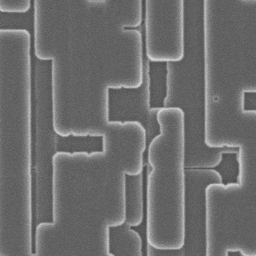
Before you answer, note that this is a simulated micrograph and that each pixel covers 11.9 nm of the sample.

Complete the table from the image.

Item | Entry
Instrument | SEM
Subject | wiring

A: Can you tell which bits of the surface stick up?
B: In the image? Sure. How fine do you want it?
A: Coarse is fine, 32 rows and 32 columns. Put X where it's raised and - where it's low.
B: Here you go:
XXXXXXXXXXXXXXXXXXXXXXX---XXXXXX
----XXXXXXXXXXXXXXXXXXX---XXXXXX
----XXXXXXXXXXXXXXXXXXX---XXXXXX
----XXXXXXXXXXXXX-XXXXX---XXXXXX
XXXXXXXXXXXXXXXXXXXXXXX---XXXXXX
XXXXXXXXXXXXXXXXXXXXXXX---XXXXXX
XXXXXXXXXXXXXXXXXXXXXXX---XXXXXX
XXXX--XXXXXXXXXXXX---X----XXXXXX
XXXX---XXXXXXXXXXX--------XXXXXX
XXXX---XXXXXXXXXXX--------XXXXXX
XXXX---XXXXXXXXXXX--------XXXXXX
XXXX---XXXXXX-------------XXXXX-
XXXX---XXXXXX-------------XXXX--
XXXX---XXXXXX-------------XXXXX-
XXXX---XXXXXX-------XXX---XXXXXX
XXXX---XXXXXXXXXX---XXX---XXXXXX
XXXX---XXXXXXXXXXX--XXX---XXXXXX
XXXX---------XXXXX-XXXX---XXXXXX
XXXX---------XXXXXXXXXX-------XX
XXXX---XXXXXXXXXXX-XXXX-------XX
XXXX---XXXXXXXXXXX-XXXX-------XX
XXXX---XXXXXXXXXX--XXXX-------XX
XXXX---XXXXXXXXX---XXXX-------XX
XXXX---XXXXXXXXX---XXXX---XXXXXX
XXXX---XXXXXXXXX---XXXX---XXXXXX
XXXX---XXXXXXXXX---XXXX---XXXXXX
XXXX---XXXXXXXXX---XXXX---XXXXXX
XXXX---XXXXXXXXX---XXXX---XXXXXX
XXXX-XXXXXXXXX-----XXXX---XXXXXX
XXXX-XXXXXXXX------XXXX---XXXXXX
XXXX-XXXXXXXX------XXXX---XXXXXX
XXXXXXXXXXXXXX------------XXX-XX